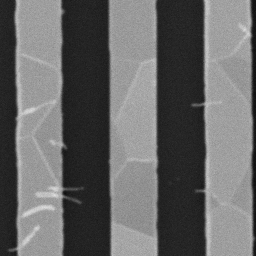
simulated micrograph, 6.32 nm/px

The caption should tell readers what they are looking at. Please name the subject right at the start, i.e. lines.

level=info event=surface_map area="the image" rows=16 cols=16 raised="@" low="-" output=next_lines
-@@@---@@@---@@@
-@@@---@@@---@@@
-@@@---@@@---@@@
-@@@---@@@---@@@
-@@@---@@@---@@@
-@@@---@@@---@@@
-@@@---@@@---@@@
-@@@---@@@---@@@
-@@@---@@@---@@@
-@@@---@@@---@@@
-@@@---@@@---@@@
-@@@---@@@---@@@
-@@@---@@@---@@@
-@@@---@@@---@@@
-@@@---@@@---@@@
-@@@---@@@---@@@